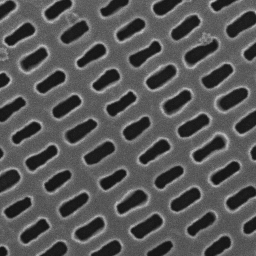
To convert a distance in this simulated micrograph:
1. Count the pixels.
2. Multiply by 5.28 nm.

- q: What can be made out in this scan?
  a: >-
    a regular array of holes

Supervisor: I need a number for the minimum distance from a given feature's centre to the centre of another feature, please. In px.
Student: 28.6